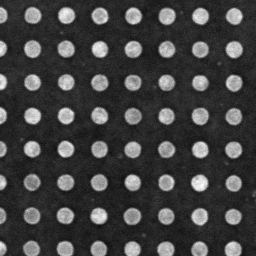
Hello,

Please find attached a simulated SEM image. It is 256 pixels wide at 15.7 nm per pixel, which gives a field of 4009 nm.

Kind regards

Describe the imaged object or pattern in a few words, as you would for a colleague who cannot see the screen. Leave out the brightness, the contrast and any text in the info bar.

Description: a regular array of raised bodies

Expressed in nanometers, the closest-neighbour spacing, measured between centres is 520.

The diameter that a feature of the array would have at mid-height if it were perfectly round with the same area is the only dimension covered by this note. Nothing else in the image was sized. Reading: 249 nm